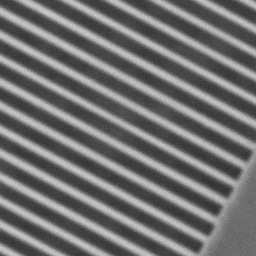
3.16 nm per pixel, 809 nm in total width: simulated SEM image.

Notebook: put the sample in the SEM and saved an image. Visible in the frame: parallel lines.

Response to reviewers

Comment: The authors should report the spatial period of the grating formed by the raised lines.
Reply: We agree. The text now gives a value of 0.0659 um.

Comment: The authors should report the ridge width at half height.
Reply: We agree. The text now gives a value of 21.2 nanometers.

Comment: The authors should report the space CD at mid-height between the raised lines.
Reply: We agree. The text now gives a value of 44.9 nanometres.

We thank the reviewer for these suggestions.